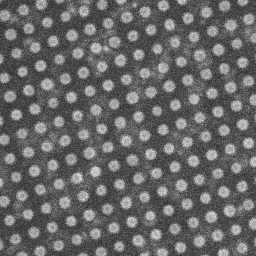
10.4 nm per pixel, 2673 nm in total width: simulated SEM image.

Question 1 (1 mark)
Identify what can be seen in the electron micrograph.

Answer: a regular array of raised bodies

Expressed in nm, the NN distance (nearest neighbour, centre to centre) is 200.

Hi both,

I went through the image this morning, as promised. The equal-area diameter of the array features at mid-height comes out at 95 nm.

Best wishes